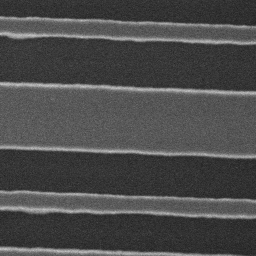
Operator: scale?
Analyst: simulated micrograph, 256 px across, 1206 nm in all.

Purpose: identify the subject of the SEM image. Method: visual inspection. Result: lines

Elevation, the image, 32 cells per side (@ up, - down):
--------------------------------
--------------------------------
@@@@@@@@@@@@@-------------------
@@@@@@@@@@@@@@@@@@@@@@@@@@@@@@@@
--------@@@@@@@@@@@@@@@@@@@@@@@@
--------------------------------
--------------------------------
--------------------------------
--------------------------------
--------------------------------
--------------------------------
@@@@@@@@@@@@@@@@@@@@@@@@@@@@----
@@@@@@@@@@@@@@@@@@@@@@@@@@@@@@@@
@@@@@@@@@@@@@@@@@@@@@@@@@@@@@@@@
@@@@@@@@@@@@@@@@@@@@@@@@@@@@@@@@
@@@@@@@@@@@@@@@@@@@@@@@@@@@@@@@@
@@@@@@@@@@@@@@@@@@@@@@@@@@@@@@@@
@@@@@@@@@@@@@@@@@@@@@@@@@@@@@@@@
--@@@@@@@@@@@@@@@@@@@@@@@@@@@@@@
----------------------------@@@@
--------------------------------
--------------------------------
--------------------------------
--------------------------------
@@@@@@@@@@@@@@@-----------------
@@@@@@@@@@@@@@@@@@@@@@@@@@@@@@@@
-----------@@@@@@@@@@@@@@@@@@@@@
--------------------------------
--------------------------------
--------------------------------
--------------------------------
@@@@@@@@@@@@@-------------------